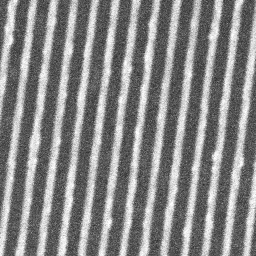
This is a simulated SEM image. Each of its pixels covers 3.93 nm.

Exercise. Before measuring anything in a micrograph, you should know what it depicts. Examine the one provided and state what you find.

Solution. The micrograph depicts parallel lines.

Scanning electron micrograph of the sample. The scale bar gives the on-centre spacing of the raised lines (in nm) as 79.9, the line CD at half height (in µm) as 0.0248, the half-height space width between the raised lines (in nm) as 56.4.